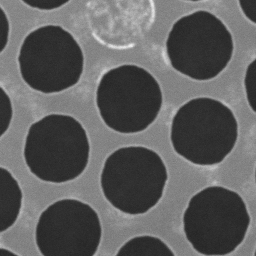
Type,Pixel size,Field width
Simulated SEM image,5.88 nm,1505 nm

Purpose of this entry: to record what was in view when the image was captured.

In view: holes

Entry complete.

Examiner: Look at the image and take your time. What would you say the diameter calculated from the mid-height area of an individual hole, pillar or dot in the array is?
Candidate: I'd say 0.393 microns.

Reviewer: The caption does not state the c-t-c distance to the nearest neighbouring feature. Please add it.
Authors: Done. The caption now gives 82.3 px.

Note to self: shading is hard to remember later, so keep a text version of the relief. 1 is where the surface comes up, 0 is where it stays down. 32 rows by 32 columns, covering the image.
11100000111111111111111111111100
01111111111111111111111100111100
01111111111111111111110000011110
01111000111111111111110000001111
01100000011111111111100000000111
01100000001111111111100000000111
11000000001111111111100000000111
11000000001111111111100000000111
11000000001111000011110000001110
11100000001110000001111000011110
11100000011100000000111111111110
01111001111100000000111111111110
01111111111100000000111100011110
01111111111100000000111000000110
01111100011110000000110000000111
01110000001110000001110000000011
01110000000111100111100000000011
11100000000111111111100000000011
11100000000111100011110000000111
11100000000111000000111000001111
11100000000110000000011110011111
01110000001110000000011111111111
00111000011110000000011111111111
00011111111110000000111111001111
00011111111110000000111100000011
00011110000111000001111100000001
00111000000011110011111000000001
00111000000011111111111000000001
01111000000001111111111000000001
11110000000001111111111000000001
11111000000011110000011100000011
01111000000011100000011110000111